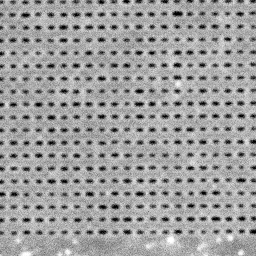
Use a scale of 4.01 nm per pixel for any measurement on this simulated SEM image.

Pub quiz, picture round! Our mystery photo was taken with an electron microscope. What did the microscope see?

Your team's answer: a regular array of holes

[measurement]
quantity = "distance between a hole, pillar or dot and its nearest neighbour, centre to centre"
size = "49.2 nm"